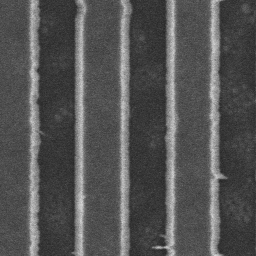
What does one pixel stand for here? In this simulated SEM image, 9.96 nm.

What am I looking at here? one or a few lines or trenches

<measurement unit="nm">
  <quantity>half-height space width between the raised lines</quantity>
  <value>427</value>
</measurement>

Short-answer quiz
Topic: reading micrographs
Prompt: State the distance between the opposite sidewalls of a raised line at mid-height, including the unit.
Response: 469 nm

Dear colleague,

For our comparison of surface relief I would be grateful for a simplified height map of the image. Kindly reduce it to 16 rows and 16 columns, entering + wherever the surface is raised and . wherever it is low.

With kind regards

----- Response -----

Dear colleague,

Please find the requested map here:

++...+++...+++..
++...+++...++...
++...+++...+++..
++...+++...+++..
++...+++...++...
++...+++...++...
++...+++...++...
++...+++...++...
++...+++...++...
++...+++...++...
++...+++...+++..
++...+++...+++..
++...+++...+++..
++...+++...++...
++...+++...+++..
++...+++...++...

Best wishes